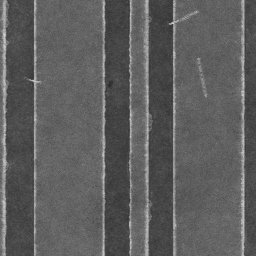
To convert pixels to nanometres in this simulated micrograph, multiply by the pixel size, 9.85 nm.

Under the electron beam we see lines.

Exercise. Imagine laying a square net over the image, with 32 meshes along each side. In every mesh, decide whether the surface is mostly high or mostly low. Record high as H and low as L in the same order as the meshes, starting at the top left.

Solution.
HLLLHHHHHHHHHLLLHHHLLLHHHHHHHHLL
HLLLHHHHHHHHHLLLHHHLLLHHHHHHHHLL
HLLLHHHHHHHHHLLLHHHLLLHHHHHHHHLL
HLLLHHHHHHHHHLLLHHHLLLHHHHHHHHLL
HLLLHHHHHHHHHLLLHHHLLLHHHHHHHHLL
HLLLHHHHHHHHHLLLHHHLLLHHHHHHHHLL
HLLLHHHHHHHHHLLLHHHLLLHHHHHHHHLL
HLLLHHHHHHHHHLLLHHHLLLHHHHHHHHLL
HLLLHHHHHHHHHLLLHHHLLLHHHHHHHHLL
HLLLHHHHHHHHHLLLHHHLLLHHHHHHHHLL
HLLLHHHHHHHHHLLLHHHLLLHHHHHHHHLL
HLLLHHHHHHHHHLLLHHHLLLHHHHHHHHLL
HLLLHHHHHHHHHLLLHHHLLLHHHHHHHHLL
HLLLHHHHHHHHHLLLHHHLLLHHHHHHHHLL
HLLLHHHHHHHHHLLLHHHLLLHHHHHHHHLL
HLLLHHHHHHHHHLLLHHHLLLHHHHHHHHLL
HLLLHHHHHHHHHLLLHHHLLLHHHHHHHHLL
HLLLHHHHHHHHHLLLHHHLLLHHHHHHHHLL
HLLLHHHHHHHHHLLLHHHLLLHHHHHHHHLL
HLLLHHHHHHHHHLLLHHHLLLHHHHHHHHLL
HLLLHHHHHHHHHLLLHHHLLLHHHHHHHHLL
HLLLHHHHHHHHHLLLHHHLLLHHHHHHHHLL
HLLLHHHHHHHHHLLLHHHLLLHHHHHHHHLL
HLLLHHHHHHHHHLLLHHHLLLHHHHHHHHLL
HLLLHHHHHHHHHLLLHHHLLLHHHHHHHHLL
HLLLHHHHHHHHHLLLHHHLLLHHHHHHHHLL
HLLLHHHHHHHHHLLLHHHLLLHHHHHHHHLL
HLLLHHHHHHHHHLLLHHHLLLHHHHHHHHLL
HLLLHHHHHHHHHLLLHHHLLLHHHHHHHHLL
HLLLHHHHHHHHHLLLHHHLLLHHHHHHHHLL
HLLLHHHHHHHHHLLLHHHLLLHHHHHHHHLL
HLLLHHHHHHHHHLLLHHHLLLHHHHHHHHLL